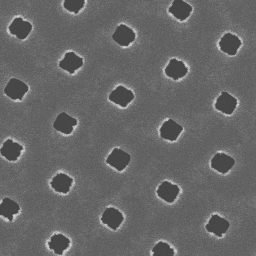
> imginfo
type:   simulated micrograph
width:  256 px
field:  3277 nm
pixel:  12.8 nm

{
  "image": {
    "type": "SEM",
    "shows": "a regular array of holes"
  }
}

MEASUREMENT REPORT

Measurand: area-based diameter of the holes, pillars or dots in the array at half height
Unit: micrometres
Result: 0.266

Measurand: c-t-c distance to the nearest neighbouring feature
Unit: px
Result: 59.5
